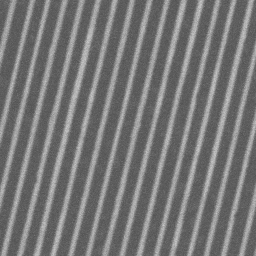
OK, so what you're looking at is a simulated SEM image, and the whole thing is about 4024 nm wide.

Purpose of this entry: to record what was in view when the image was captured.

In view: parallel lines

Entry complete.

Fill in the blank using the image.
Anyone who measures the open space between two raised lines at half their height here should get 200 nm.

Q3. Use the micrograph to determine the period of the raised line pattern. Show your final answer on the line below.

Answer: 258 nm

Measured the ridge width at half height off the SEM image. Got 59.2 nm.